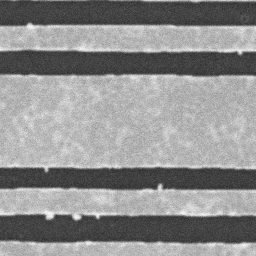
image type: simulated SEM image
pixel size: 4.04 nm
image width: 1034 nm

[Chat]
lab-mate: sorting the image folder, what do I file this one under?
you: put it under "lines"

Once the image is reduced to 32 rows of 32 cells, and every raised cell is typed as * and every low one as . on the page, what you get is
................................
................................
................................
********************************
********************************
********************************
................................
................................
................................
*****....*...*********..........
********************************
********************************
********************************
********************************
********************************
********************************
********************************
********************************
********************************
********************************
********************************
................................
................................
................................
********************************
********************************
********************************
................................
................................
................................
***********************..***..**
********************************